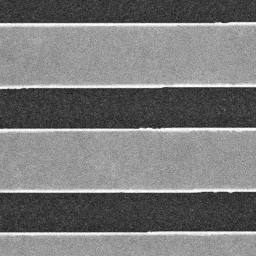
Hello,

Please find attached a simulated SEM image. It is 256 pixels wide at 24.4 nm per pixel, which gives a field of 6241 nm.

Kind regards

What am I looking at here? lines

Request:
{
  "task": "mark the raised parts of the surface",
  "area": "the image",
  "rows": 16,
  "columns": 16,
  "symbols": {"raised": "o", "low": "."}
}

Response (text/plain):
................
..oooooooooooooo
oooooooooooooooo
oooooooooooooooo
oooooooooooooooo
o...............
................
................
oooooooooooooooo
oooooooooooooooo
oooooooooooooooo
oooooooooooooooo
................
................
................
oooooooooooooooo